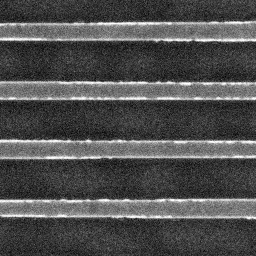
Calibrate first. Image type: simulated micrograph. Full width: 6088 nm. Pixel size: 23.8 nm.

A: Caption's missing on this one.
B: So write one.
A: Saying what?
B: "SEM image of lines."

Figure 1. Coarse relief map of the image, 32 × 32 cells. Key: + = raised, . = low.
................................
................................
................................
++++++++++++++++++++++++++++++++
++++++++++++++++++++++++++++++++
................................
................................
................................
................................
................................
++++++++++++++++++++++++++++++++
++++++++++++++++++++++++++++++++
................................
................................
................................
................................
................................
................................
++++++++++++++++++++++++++++++++
++++++++++++++++++++++++++++++++
................................
................................
................................
................................
................................
++++++++++++++++++++++++++++++++
++++++++++++++++++++++++++++++++
................................
................................
................................
................................
................................